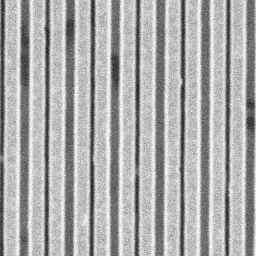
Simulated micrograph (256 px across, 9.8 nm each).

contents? parallel lines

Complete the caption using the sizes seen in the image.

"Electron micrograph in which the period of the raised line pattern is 0.221 microns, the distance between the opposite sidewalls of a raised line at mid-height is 146 nm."